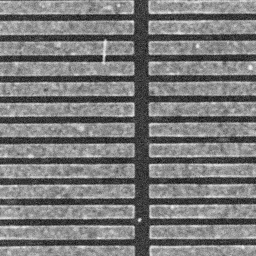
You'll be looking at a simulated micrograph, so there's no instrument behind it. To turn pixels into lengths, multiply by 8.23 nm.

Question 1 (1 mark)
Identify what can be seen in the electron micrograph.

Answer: groups of lines, slits or small figures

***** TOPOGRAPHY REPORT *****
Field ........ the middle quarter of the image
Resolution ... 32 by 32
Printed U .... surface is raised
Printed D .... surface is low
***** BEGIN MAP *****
UUUUUUUUUUUUUUUUUDDDDUUUUUUUUUUU
UUUUUUUUUUUUUUUUUDDDDUUUUUUUUUUU
UUUUUUUUUUUUUUUUUDDDDUUUUUUUUUUU
DDDDDDDDDDDDDDDDDDDDDDDDDDDDDDDD
DDDDDDDDDDDDDDDDDDDDDDDDDDDDDDDD
UUUUUUUUUUUUUUUUUDDDDUUUUUUUUUUU
UUUUUUUUUUUUUUUUUDDDDUUUUUUUUUUU
UUUUUUUUUUUUUUUUUDDDDUUUUUUUUUUU
DDDDDDDDDDDDDDDDDDDDDDDDDDDDDDDD
DDDDDDDDDDDDDDDDDDDDDDDDDDDDDDDD
UUUUUUUUUUUUUUUUUDDDDUUUUUUUUUUU
UUUUUUUUUUUUUUUUUDDDDUUUUUUUUUUU
UUUUUUUUUUUUUUUUUDDDDUUUUUUUUUUU
DDDDDDDDDDDDDDDDDDDDDDDDDDDDDDDD
DDDDDDDDDDDDDDDDDDDDDDDDDDDDDDDD
UUUUUUUUUUUUUUUUUDDDDDUUUUUUUUUU
UUUUUUUUUUUUUUUUUDDDDDUUUUUUUUUU
UUUUUUUUUUUUUUUUUDDDDDUUUUUUUUUU
DDDDDDDDDDDDDDDDDDDDDDDDDDDDDDDD
DDDDDDDDDDDDDDDDDDDDDDDDDDDDDDDD
UUUUUUUUUUUUUUUUUDDDDDUUUUUUUUUU
UUUUUUUUUUUUUUUUUDDDDUUUUUUUUUUU
UUUUUUUUUUUUUUUUUDDDDUUUUUUUUUUU
DDDDDDDDDDDDDDDDDDDDDDDDDDDDDDDD
DDDDDDDDDDDDDDDDDDDDDDDDDDDDDDDD
UUUUUUUUUUUUUUUUUUDDDDUUUUUUUUUU
UUUUUUUUUUUUUUUUUUDDDUUUUUUUUUUU
UUUUUUUUUUUUUUUUUUDDDUUUUUUUUUUU
DDDDDDDDDDDDDDDDDDDDDDDDDDDDDDDD
DDDDDDDDDDDDDDDDDDDDDDDDDDDDDDDD
UUUUUUUUUUUUUUUUUUDDDUUUUUUUUUUU
UUUUUUUUUUUUUUUUUUDDDUUUUUUUUUUU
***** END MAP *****